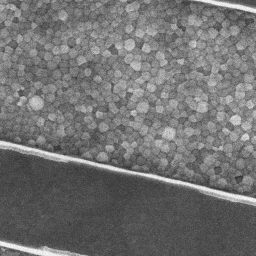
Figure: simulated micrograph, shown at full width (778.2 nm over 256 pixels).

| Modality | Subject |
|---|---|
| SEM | one or a few lines or trenches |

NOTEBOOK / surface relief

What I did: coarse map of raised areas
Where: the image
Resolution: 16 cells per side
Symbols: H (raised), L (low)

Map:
LLLLLLLLLLLLLLLH
LLLLLLLLLLLLLLLL
LLLLLLLLLLLLLLLL
LLLLLLLLLLLLLLLL
LLLLLLLLLLLLLLLL
LLLLLLLLLLLLLLLL
LLLLLLLLLLLLLLLL
LLLLLLLLLLLLLLLL
LLLLLLLLLLLLLLLL
HHLLLLLLLLLLLLLL
HHHHHHHLLLLLLLLL
HHHHHHHHHHHHLLLL
HHHHHHHHHHHHHHHH
HHHHHHHHHHHHHHHH
HHHHHHHHHHHHHHHH
LHHHHHHHHHHHHHHH